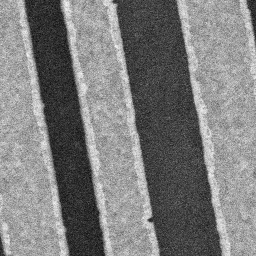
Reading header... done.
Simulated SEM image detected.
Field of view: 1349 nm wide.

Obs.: one or a few lines or trenches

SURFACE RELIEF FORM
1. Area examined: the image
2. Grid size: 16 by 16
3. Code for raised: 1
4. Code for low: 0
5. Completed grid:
1000111000011110
1100111000011111
1100111100001111
1100011100001111
1100011100001111
1100011100001111
1110011100001111
1110011100001111
1110011110000111
1110001110000111
1110001110000111
1110001110000111
1111001110000111
1111001110000011
1111001111000011
1111000111000011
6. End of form